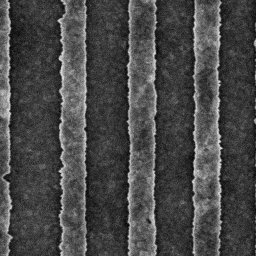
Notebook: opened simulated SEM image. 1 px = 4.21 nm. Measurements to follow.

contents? one or a few lines or trenches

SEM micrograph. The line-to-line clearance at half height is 0.185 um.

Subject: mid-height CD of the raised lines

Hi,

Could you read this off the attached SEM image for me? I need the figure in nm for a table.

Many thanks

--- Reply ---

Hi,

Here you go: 102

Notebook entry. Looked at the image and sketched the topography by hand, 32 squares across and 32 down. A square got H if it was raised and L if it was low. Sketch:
HLLLLLLLHHHLLLLLHHHLLLLLHHHLLLLL
HLLLLLLLHHHLLLLLHHHLLLLLHHHLLLLL
HLLLLLLLHHHLLLLLHHHLLLLLHHHLLLLL
HLLLLLLLHHHLLLLLHHHLLLLLHHHLLLLL
HLLLLLLLHHHLLLLLHHHLLLLLHHHLLLLL
HLLLLLLLHHHLLLLLHHHLLLLLHHHLLLLL
HLLLLLLLHHHLLLLLHHHLLLLLHHHLLLLL
HLLLLLLLHHHLLLLLHHHLLLLLLHHLLLLL
HLLLLLLLHHHLLLLLHHHLLLLLHHHLLLLL
HLLLLLLLHHHLLLLLHHHLLLLLHHHLLLLL
HLLLLLLLHHHLLLLLHHHLLLLLHHHLLLLL
HLLLLLLLHHHLLLLLHHHLLLLLHHHLLLLL
HLLLLLLLHHHLLLLLHHHHLLLLHHHLLLLL
HLLLLLLLHHHLLLLLHHHLLLLLHHHLLLLL
HLLLLLLLHHHLLLLLHHHLLLLLHHHLLLLL
HLLLLLLLHHHLLLLLHHHLLLLLHHHLLLLL
HLLLLLLLHHHLLLLLHHHLLLLLHHHLLLLL
HLLLLLLLHHHLLLLLHHHLLLLLHHHHLLLL
HLLLLLLLHHHLLLLLHHHLLLLLHHHLLLLL
HLLLLLLLHHHLLLLLHHHLLLLLHHHHLLLL
HLLLLLLLHHHLLLLLHHHLLLLLHHHHLLLL
HLLLLLLLHHHLLLLLHHHLLLLLHHHLLLLL
HLLLLLLLHHHLLLLLHHHLLLLLHHHLLLLL
HLLLLLLLHHHLLLLLHHHLLLLLHHHHLLLL
HLLLLLLLHHHLLLLLHHHLLLLLHHHHLLLL
HLLLLLLLHHHLLLLLHHHLLLLLHHHLLLLL
HLLLLLLLHHHLLLLLHHHLLLLLHHHHLLLL
HLLLLLLLHHHLLLLLHHLLLLLLHHHHLLLL
HLLLLLLLHHHLLLLLHHHLLLLLHHHHLLLL
HLLLLLLLHHHLLLLLHHHLLLLLHHHLLLLL
HLLLLLLLHHHLLLLLHHHLLLLLHHHLLLLL
HLLLLLLLHHHLLLLLHHHLLLLLHHHLLLLL